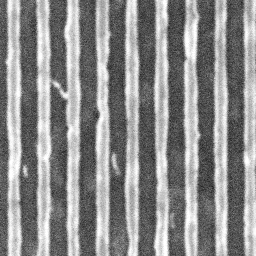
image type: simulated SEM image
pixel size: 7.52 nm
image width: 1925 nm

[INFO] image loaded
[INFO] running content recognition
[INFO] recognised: parallel lines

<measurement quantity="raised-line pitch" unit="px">29.6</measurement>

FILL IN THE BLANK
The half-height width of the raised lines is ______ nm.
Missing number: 66.3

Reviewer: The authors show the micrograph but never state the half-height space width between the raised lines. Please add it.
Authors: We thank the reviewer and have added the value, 0.153 micrometres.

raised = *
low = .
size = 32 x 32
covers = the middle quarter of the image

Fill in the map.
.**......*......**.....***.....*
.**......*......**.....***.....*
.**......**.....**.....**......*
.**......**.....**.....**......*
.**......**.....**.....**......*
.**......**.....**.....***.....*
.**......**.....**.....***.....*
.**......**.....**.....***.....*
.**......**.....**.....***.....*
.**......**.....**.....***.....*
.**......**.....**.....**......*
.**......**.....**.....***....**
.**.......*.....**.....***....**
.**......**.....**.....***....**
.**......**.....**.....***....**
.**......**.....**.....**.....**
..*......**.....**.....**.....**
.**......**.....**.....**......*
.**......**.....**.....**......*
.**.....***.....**.....**......*
.**.....***.....**.....**......*
.**.....***.....**.....**......*
.***....***.....**.....**......*
.***.....**.....**.....**......*
.**......**.....**.....**......*
.**.....***.....**.....**......*
.**.....***.....**.....**......*
.**......**.....**.....**......*
.**......**.....**......*......*
.**......**.....**......**.....*
.**......**.....**......**.....*
.**......**.....**.....***.....*